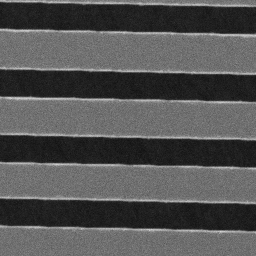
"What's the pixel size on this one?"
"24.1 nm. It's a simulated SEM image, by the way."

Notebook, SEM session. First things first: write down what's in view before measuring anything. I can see lines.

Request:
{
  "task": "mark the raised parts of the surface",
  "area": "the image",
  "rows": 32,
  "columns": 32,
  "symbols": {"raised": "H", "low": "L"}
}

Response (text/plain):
LLLLLLLLLLLLLLLLLHHHHHHHHHHHHHHH
LLLLLLLLLLLLLLLLLLLLLLLLLLLLLLLL
LLLLLLLLLLLLLLLLLLLLLLLLLLLLLLLL
LLLLLLLLLLLLLLLLLLLLLLLLLLLLLLLL
HHHHHHHHHHHHHHHHHHHHHHHHHHHHHHHH
HHHHHHHHHHHHHHHHHHHHHHHHHHHHHHHH
HHHHHHHHHHHHHHHHHHHHHHHHHHHHHHHH
HHHHHHHHHHHHHHHHHHHHHHHHHHHHHHHH
HHHHHHHHHHHHHHHHHHHHHHHHHHHHHHHH
LLLLLLLLLLLLLLLLLLLLLLLLLLLLLLLL
LLLLLLLLLLLLLLLLLLLLLLLLLLLLLLLL
LLLLLLLLLLLLLLLLLLLLLLLLLLLLLLLL
HHHHHHHHHHHHHHHLLLLLLLLLLLLLLLLL
HHHHHHHHHHHHHHHHHHHHHHHHHHHHHHHH
HHHHHHHHHHHHHHHHHHHHHHHHHHHHHHHH
HHHHHHHHHHHHHHHHHHHHHHHHHHHHHHHH
HHHHHHHHHHHHHHHHHHHHHHHHHHHHHHHH
LLLLLLLLLLLLLLLLLLLLLLLLLLLLLLLL
LLLLLLLLLLLLLLLLLLLLLLLLLLLLLLLL
LLLLLLLLLLLLLLLLLLLLLLLLLLLLLLLL
HHHHHHHHHHLLLLLLLLLLLLLLLLLLLLLL
HHHHHHHHHHHHHHHHHHHHHHHHHHHHHHHH
HHHHHHHHHHHHHHHHHHHHHHHHHHHHHHHH
HHHHHHHHHHHHHHHHHHHHHHHHHHHHHHHH
HHHHHHHHHHHHHHHHHHHHHHHHHHHHHHHH
LLLLLLLLLLLLLLLLLLLLLLLLLLLLLLLL
LLLLLLLLLLLLLLLLLLLLLLLLLLLLLLLL
LLLLLLLLLLLLLLLLLLLLLLLLLLLLLLLL
HHHHHHHHHHHLLLLLLLLLLLLLLLLLLLLL
HHHHHHHHHHHHHHHHHHHHHHHHHHHHHHHH
HHHHHHHHHHHHHHHHHHHHHHHHHHHHHHHH
HHHHHHHHHHHHHHHHHHHHHHHHHHHHHHHH